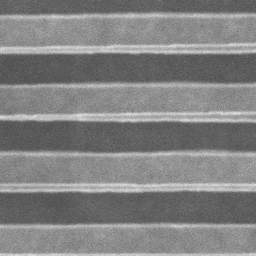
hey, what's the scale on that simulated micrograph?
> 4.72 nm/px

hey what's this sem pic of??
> lines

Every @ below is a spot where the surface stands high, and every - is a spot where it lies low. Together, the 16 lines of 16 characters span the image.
----------------
@@@@@@@@@@@@@@@@
@@@@@@@@@@@@@@@@
----------------
----------------
@@@@@@@@@@@@@@@@
@@@@@@@@@@@@@@@@
-----@@@@@@@@@@@
----------------
----------------
@@@@@@@@@@@@@@@@
@@@@@@@@@@@@@@@@
----------------
----------------
@@@@@@@@@@@@@@@@
@@@@@@@@@@@@@@@@